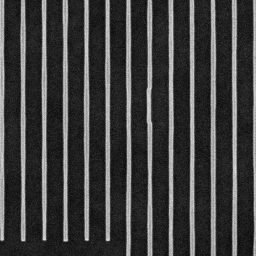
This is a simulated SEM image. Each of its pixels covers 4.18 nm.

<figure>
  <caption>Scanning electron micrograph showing parallel lines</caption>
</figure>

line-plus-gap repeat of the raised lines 88.4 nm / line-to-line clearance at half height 0.0726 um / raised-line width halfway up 14.6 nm